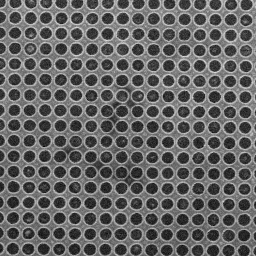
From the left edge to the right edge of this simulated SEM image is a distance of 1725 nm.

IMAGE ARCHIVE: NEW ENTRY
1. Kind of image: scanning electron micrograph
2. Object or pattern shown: a regular array of holes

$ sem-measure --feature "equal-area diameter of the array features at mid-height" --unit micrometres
0.0819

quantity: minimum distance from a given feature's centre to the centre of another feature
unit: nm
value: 102